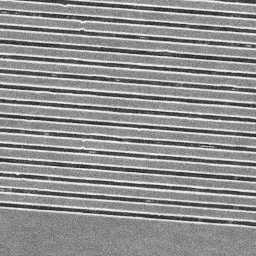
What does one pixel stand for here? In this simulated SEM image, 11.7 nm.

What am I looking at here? parallel lines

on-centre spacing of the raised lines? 14.8 pixels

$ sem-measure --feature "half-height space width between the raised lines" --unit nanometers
62.6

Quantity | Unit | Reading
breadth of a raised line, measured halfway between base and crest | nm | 116